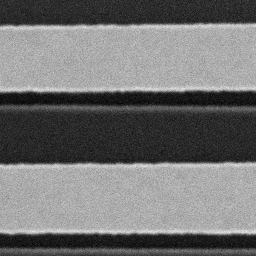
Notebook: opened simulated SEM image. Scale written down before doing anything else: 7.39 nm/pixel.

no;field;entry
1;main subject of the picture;lines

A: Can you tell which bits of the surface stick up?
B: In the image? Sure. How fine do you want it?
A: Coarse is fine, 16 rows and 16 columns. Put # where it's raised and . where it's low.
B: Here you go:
................
................
################
################
################
################
................
................
................
................
################
################
################
################
################
................